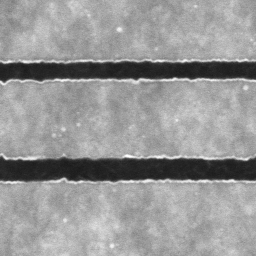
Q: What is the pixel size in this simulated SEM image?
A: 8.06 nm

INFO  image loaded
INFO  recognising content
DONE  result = one or a few lines or trenches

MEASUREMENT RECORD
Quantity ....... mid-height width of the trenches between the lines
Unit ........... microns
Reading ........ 0.613